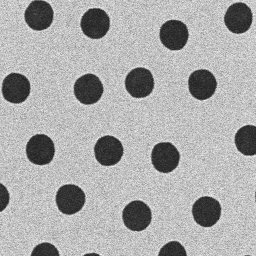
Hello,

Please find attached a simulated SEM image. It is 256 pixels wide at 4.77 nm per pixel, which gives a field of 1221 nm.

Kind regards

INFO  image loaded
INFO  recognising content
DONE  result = a regular array of holes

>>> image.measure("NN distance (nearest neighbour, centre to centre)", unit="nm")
275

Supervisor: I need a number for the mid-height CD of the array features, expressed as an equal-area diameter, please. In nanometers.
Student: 144